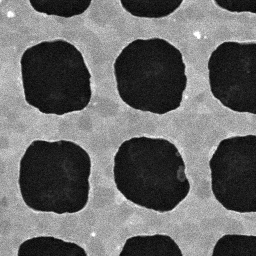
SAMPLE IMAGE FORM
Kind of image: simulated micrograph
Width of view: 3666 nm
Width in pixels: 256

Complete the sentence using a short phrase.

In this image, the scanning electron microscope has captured holes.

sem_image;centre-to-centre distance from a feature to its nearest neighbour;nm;1370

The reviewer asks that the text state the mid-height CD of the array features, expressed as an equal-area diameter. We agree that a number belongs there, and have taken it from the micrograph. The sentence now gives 1.08 micrometres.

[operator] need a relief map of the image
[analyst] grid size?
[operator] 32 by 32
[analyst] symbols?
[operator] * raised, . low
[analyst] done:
****.......****........****.....
*****.....******......*********.
********************************
********************************
********************************
*****....*******.....*******....
***.......*****.......*****.....
***.......****.........***......
***........***.........***......
***........***.........***......
***........****........***......
***........****........***......
***........****........****.....
*****......******.....*******...
********************************
********************************
********************************
****************.....*******....
***.......*****.......*****.....
***........***.........****.....
**.........***.........***......
**.........***.........***......
**.........***..........**......
**.........****.........**......
***........****........****.....
***........******.....******....
*******..***********.*********..
********************************
********************************
*****.***********....*******....
***......*******......*****.....
**.........****........****.....